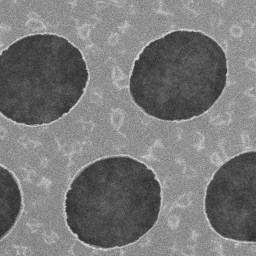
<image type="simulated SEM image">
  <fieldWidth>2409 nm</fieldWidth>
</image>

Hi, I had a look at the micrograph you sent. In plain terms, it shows holes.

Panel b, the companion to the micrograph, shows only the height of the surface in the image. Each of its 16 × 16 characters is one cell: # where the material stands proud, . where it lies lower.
################
################
#...######...###
.....####.....##
.....###......##
.....###......##
.....####....###
#..#######.#####
################
################
#####....#####..
.###......###...
.###......###...
.###......###...
#####....#####..
######.#########